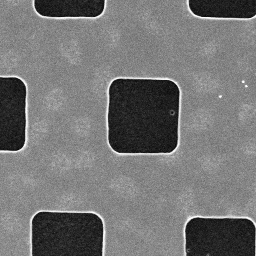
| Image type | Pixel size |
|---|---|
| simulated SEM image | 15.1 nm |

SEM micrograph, holes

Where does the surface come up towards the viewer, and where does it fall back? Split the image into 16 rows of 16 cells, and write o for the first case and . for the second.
oo....oooooo....
oooooooooooooooo
oooooooooooooooo
oooooooooooooooo
oooooooooooooooo
..ooooo....ooooo
..ooooo....ooooo
..ooooo....ooooo
..ooooo....ooooo
ooooooo....ooooo
oooooooooooooooo
oooooooooooooooo
oooooooooooooooo
oo....oooooooooo
oo....oooooo....
oo....oooooo....